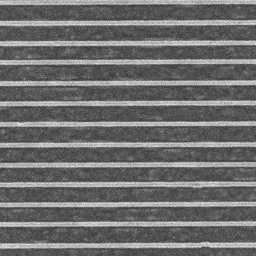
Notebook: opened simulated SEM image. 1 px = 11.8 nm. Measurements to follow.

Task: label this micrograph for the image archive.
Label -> parallel lines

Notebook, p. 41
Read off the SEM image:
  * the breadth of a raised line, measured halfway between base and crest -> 41.4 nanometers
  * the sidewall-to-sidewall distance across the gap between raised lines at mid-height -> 198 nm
